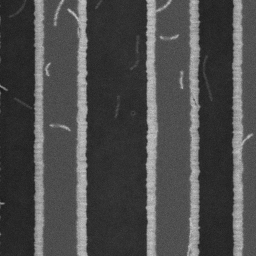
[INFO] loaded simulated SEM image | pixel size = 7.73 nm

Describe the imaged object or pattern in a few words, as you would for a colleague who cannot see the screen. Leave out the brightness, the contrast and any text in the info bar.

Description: lines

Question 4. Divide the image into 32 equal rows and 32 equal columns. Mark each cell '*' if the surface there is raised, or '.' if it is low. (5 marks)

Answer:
.....******........******....***
.....******........******....***
.....******........******....***
.....******........******....***
.....******........******....***
.....******........******....***
.....******........******.....**
.....******........******....***
.....******........******....***
.....******........******....***
.....******........******....***
.....******........******....***
.....******........******....***
.....******........******....***
.....******........******....***
.....******........******....***
.....******........******....***
.....******........******....***
.....*****.........******....***
.....*****.........******....***
.....******........******....***
.....******........******....***
.....******........******....***
.....******........******....***
.....*****.........******.....**
.....******........******.....**
.....******........******....***
.....******........******....***
.....******........******....***
.....******........******.....**
.....******........******.....**
.....******........******....***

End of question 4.